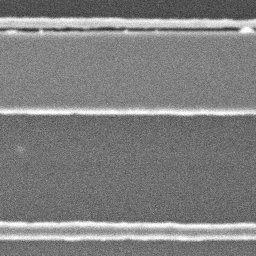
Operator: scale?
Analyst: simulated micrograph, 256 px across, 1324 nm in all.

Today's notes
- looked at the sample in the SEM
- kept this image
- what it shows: lines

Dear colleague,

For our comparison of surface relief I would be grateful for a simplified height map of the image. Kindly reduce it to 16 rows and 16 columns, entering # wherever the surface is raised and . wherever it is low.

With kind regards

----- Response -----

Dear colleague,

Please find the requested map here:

................
################
################
################
################
################
################
................
................
................
................
................
................
................
################
################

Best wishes